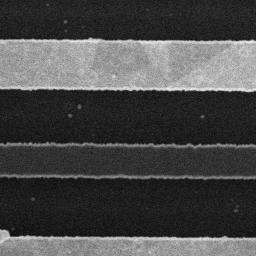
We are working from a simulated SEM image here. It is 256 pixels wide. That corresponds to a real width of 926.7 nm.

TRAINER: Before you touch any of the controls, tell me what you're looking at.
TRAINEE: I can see lines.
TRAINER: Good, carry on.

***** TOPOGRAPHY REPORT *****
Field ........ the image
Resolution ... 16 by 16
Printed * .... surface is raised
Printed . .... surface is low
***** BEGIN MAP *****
................
................
.*..............
****************
****************
****************
................
................
................
****************
****************
................
................
................
................
****************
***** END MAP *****